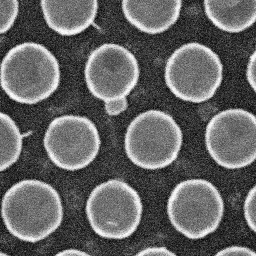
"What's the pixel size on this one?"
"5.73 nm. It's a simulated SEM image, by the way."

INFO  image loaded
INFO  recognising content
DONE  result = a regular array of raised bodies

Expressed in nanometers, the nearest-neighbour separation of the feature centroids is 456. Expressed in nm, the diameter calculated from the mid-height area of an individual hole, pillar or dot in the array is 316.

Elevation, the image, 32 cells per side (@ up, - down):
@@---@@@@@@@----@@@@@@----@@@@@@
@@----@@@@@@----@@@@@@----@@@@@@
@@----@@@@@@----@@@@@@-----@@@@@
@------@@@@-------@@@-------@@--
--------------------------------
--------------------------------
-@@@@@------@@@@------@@@@------
-@@@@@@----@@@@@@----@@@@@@----@
@@@@@@@----@@@@@@----@@@@@@@---@
@@@@@@@----@@@@@@----@@@@@@@---@
@@@@@@@----@@@@@@----@@@@@@----@
-@@@@@------@@@@------@@@@@-----
--@@@-------------------@-------
--------------------------------
@-----------------@@@------@@@@@
@@----@@@@@------@@@@@----@@@@@@
@@----@@@@@@----@@@@@@----@@@@@@
@@@---@@@@@@----@@@@@@----@@@@@@
@@----@@@@@@----@@@@@@----@@@@@@
@@----@@@@@@----@@@@@@-----@@@@@
@------@@@@------@@@@-------@@@-
--------------------------------
--------------------------------
--@@@@------@@@@------@@@@@-----
-@@@@@@----@@@@@@-----@@@@@----@
@@@@@@@----@@@@@@@---@@@@@@@---@
@@@@@@@@---@@@@@@@---@@@@@@@---@
-@@@@@@@---@@@@@@----@@@@@@----@
-@@@@@@-----@@@@@-----@@@@@-----
--@@@@--------@@--------@-------
--------------------------------
--------@@--------@@@-------@@@-